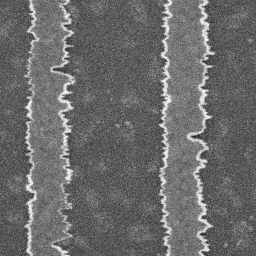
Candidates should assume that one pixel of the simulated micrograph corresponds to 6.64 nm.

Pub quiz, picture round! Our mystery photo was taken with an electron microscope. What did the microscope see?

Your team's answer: one or a few lines or trenches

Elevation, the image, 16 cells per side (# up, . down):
..##......###...
..##......###...
..##......###...
..##......###...
..##......###...
..##......###...
..##......###...
..##......###...
..##......##....
..##......###...
..##......###...
..##......###...
..##......###...
..##......###...
..##......###...
..##......###...